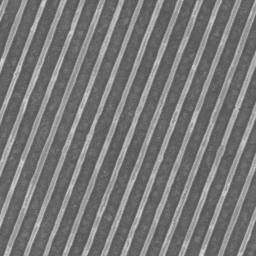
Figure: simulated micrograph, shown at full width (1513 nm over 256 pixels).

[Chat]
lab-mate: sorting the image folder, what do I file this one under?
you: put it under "parallel lines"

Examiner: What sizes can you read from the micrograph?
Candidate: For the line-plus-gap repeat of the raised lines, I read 108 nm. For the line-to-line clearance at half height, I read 13.3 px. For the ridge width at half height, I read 0.0263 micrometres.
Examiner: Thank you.